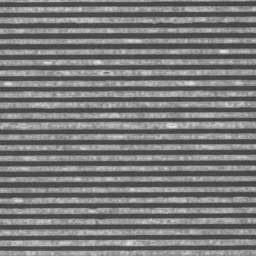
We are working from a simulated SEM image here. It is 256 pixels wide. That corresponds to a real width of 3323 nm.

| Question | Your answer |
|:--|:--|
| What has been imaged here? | parallel lines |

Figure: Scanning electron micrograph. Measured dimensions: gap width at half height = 0.0698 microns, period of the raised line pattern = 138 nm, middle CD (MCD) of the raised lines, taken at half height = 0.0617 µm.